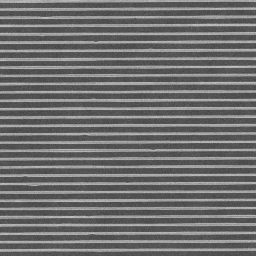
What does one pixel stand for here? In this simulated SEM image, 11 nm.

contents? parallel lines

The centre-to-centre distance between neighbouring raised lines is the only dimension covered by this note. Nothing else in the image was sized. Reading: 0.0913 micrometres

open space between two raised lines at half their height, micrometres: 0.0673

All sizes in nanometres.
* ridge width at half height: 24.7